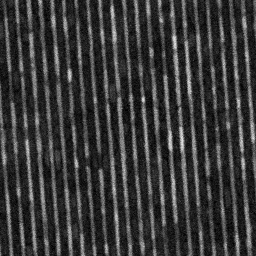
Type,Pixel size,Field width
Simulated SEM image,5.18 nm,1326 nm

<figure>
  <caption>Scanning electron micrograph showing parallel lines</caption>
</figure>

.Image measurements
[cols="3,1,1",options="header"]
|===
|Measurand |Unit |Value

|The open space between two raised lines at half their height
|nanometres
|48.4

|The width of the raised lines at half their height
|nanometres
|13.6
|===